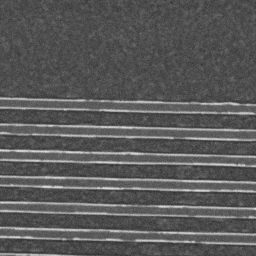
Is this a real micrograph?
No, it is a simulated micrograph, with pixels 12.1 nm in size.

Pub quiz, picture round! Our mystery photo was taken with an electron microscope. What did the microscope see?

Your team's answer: parallel lines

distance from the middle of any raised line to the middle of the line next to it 314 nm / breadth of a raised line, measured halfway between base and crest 121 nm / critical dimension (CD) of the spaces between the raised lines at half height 194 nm